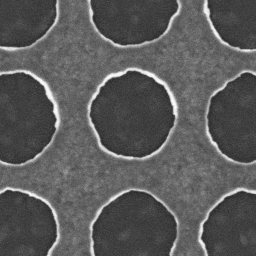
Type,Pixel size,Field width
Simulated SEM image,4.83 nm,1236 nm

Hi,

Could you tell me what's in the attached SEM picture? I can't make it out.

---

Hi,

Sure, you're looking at holes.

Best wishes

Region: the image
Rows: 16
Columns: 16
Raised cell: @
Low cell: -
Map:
----@@-----@@---
---@@@-----@@---
--@@@@@---@@@@--
@@@@@@@@@@@@@@@@
@@@@@@@@-@@@@@@@
---@@@----@@@@--
---@@@-----@@---
---@@@-----@@---
---@@@-----@@---
---@@@@---@@@@--
@@@@@@@@@@@@@@@@
@@@@@@@@@@@@@@@@
---@@@@---@@@@--
---@@@-----@@---
----@@-----@@---
---@@@-----@@---